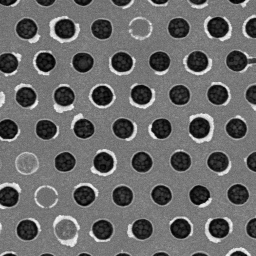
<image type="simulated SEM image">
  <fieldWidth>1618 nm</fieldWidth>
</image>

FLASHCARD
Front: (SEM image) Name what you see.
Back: a regular array of holes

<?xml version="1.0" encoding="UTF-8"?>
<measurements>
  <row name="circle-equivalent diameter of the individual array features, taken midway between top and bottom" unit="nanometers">133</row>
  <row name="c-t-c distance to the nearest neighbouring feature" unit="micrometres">0.239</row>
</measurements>